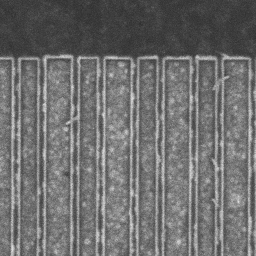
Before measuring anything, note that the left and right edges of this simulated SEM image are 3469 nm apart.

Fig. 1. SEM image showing parallel lines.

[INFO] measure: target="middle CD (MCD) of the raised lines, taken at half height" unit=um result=0.108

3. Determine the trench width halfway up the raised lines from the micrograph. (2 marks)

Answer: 279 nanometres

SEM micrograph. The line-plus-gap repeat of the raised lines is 394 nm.